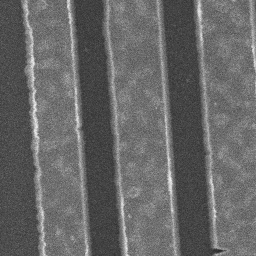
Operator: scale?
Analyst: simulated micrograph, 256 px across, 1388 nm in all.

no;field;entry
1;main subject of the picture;one or a few lines or trenches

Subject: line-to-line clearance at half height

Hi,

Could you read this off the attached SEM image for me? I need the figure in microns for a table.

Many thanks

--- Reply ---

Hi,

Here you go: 0.187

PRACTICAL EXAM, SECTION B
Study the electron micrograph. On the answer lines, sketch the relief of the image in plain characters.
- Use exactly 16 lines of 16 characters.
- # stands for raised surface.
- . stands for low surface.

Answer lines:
.####..###..####
..###..###..####
..###..###..####
..###..###..####
..###..###...###
..###..###...###
..###..###...###
..###..####..###
..###..####..###
..###..####..###
..###..####..###
..###..####..###
..###..####..###
..###...###..###
...###..###..###
...###..###..###